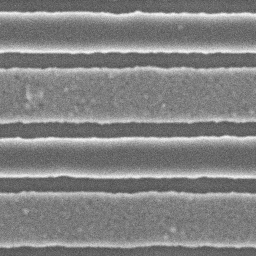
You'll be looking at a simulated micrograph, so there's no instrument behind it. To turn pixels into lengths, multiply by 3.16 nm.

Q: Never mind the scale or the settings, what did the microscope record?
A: lines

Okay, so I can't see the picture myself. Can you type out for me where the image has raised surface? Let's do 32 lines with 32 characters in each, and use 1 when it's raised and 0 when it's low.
00000000000000000000000000000000
00000000000000000100000000000000
11111111111111111111111111111111
11111111111111111111111111111111
11111111111111111111111111111111
11111111111111111111111111111111
10111111111111010111111111111111
00000000000000000000000000000000
00000000000000000111000000000000
11111111111111111111111111111111
11111111111111111111111111111111
11111111111111111111111111111111
11111111111111111111111111111111
11111111111111111111111111111111
11111111111111111111111111111111
00000000000000000000000000000000
00000000000000000000000000000000
11111111111111111111111111111111
11111111111111111111111111111111
11111111111111111111111111111111
11111111111111111111111111111111
11111111111111111111111111111111
00000000000000000000000000000000
00000000000000000000000000000000
11111111111111111111111111111111
11111111111111111111111111111111
11111111111111111111111111111111
11111111111111111111111111111111
11111111111111111111111111111111
11111111111111111111111111111111
11111111111111111111111111111111
00000000000000000000000000000000